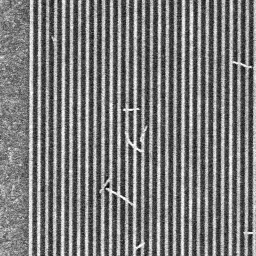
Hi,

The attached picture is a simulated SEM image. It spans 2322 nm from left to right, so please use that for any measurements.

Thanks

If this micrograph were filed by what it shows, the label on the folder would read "parallel lines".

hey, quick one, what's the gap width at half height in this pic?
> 52.2 nm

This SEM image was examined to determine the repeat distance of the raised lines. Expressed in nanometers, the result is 72.4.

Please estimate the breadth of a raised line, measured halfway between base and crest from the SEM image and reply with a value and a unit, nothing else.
18.1 nm